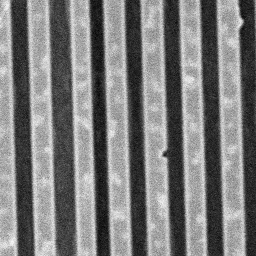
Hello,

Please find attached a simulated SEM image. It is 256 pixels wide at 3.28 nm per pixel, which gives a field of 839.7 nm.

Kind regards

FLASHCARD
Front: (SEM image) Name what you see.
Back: parallel lines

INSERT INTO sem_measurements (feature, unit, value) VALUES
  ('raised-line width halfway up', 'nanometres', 69.7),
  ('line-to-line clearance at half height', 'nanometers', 54.5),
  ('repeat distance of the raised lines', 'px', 37.9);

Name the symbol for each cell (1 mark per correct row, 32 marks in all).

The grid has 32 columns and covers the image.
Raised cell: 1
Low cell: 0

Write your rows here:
10011100011001110011001110011100
10001100011001110011001110011100
10001100011001110011001110011100
10001100011001110011000110011100
10001100011001110011000110011100
10001100011001110011000110011100
10001100011001110011000110011100
10001100011001110011000110011100
10001100011001110011000110011100
10001100011001110011100110011100
11001100011001110011100110011100
11001100011001110011100110011100
11001100011001110011100110001100
11001100011001110011100110001100
11001100011101110011100110001100
11001100011101110011100110001100
11001100011101110011100110001100
11001110011101110011100110001100
11001110011101110011100111001100
11001110011101110011000111001100
11001110011100110011100111001100
11001110011100110011100111001100
11001110011100110011100111001100
11001110011100110011100111001100
11001110011100110011100111001100
11001110001100110011100111001100
11001110001100110011100111001100
11001110001100110011100111001100
11001110001100110011100111001110
11001110001100110001100111001110
11001110001100110001100111001110
11001110001100110001100111001110